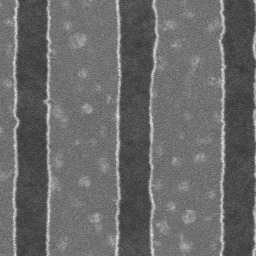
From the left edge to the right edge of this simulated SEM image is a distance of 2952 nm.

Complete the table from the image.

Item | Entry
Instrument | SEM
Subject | one or a few lines or trenches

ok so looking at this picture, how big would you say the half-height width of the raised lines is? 0.389 microns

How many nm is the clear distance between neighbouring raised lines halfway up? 798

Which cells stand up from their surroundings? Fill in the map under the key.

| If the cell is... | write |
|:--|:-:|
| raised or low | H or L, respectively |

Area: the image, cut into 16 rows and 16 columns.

LHHLLLLHHHLLLLHH
LHHLLLLHHHLLLLHH
LHHLLLLHHHLLLLHH
LHHLLLLHHHLLLLHH
LHHLLLLHHHLLLLHH
LHHLLLLHHLLLLLHH
LHHLLLLHHLLLLLHH
LHHLLLLHHLLLLLHH
LHHLLLLHHHLLLLHH
LHHLLLLHHLLLLLHH
LHHLLLLHHLLLLLHH
LHHLLLLHHLLLLLHH
LHHLLLLHHHLLLLHH
LHHLLLLHHLLLLLHH
LHHLLLLHHLLLLLHH
LHHLLLLHHHLLLLHH